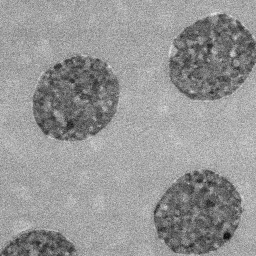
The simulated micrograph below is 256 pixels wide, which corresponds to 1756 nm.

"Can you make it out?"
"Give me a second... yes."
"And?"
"raised bodies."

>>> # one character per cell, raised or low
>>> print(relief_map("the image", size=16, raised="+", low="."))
................
............+++.
...........+++++
.....+.....+++++
...++++....+++++
..+++++....++++.
..+++++.........
..+++++.........
...+++..........
................
................
...........++++.
..........+++++.
..........+++++.
.+++......+++++.
+++++......+++..